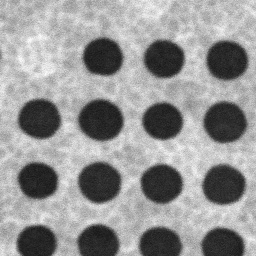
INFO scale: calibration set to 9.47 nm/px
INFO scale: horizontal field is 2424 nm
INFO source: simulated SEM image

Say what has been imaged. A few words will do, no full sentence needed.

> a regular array of holes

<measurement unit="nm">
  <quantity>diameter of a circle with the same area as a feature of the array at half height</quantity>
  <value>398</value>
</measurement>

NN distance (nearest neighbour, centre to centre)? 582 nanometers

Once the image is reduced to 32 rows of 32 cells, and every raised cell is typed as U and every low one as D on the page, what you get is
UUUUUUUUUUUUUUUUUUUUUUUUUUUUUUUU
UUUUUUUUUUUUUUUUUUUUUUUUUUUUUUUU
UUUUUUUUUUUUUUUUUUUUUUUUUUUUUUUU
UUUUUUUUUUUUUUUUUUUUUUUUUUUUUUUU
UUUUUUUUUUUUUUUUUUUUUUUUUUUUUUUU
UUUUUUUUUUUDDDDUUUUDDDUUUUUDDDUU
UUUUUUUUUUDDDDDUUUDDDDDUUUDDDDDU
UUUUUUUUUUDDDDDUUUDDDDDUUUDDDDDU
UUUUUUUUUUUDDDDUUUDDDDDUUUDDDDDU
UUUUUUUUUUUUUUUUUUUDDDUUUUUDDDUU
UUUUUUUUUUUUUUUUUUUUUUUUUUUUUUUU
UUUUUUUUUUUUUUUUUUUUUUUUUUUUUUUU
UUUUDDUUUUUUDUUUUUUUUUUUUUUUUUUU
UUUDDDDUUUDDDDDUUUDDDDUUUUDDDDUU
UUDDDDDDUUDDDDDUUUDDDDDUUDDDDDDU
UUDDDDDDUUDDDDDUUUDDDDDUUDDDDDDU
UUUDDDDUUUDDDDDUUUDDDDDUUUDDDDDU
UUUUUUUUUUUUDDUUUUUUDUUUUUUDDDUU
UUUUUUUUUUUUUUUUUUUUUUUUUUUUUUUU
UUUUUUUUUUUUUUUUUUUUUUUUUUUUUUUU
UUUDDDUUUUUDDDUUUUUUUUUUUUUUUUUU
UUDDDDDUUUDDDDDUUUDDDDUUUUDDDDUU
UUDDDDDUUUDDDDDUUUDDDDDUUDDDDDDU
UUUDDDDUUUDDDDDUUUDDDDDUUDDDDDDU
UUUDDDUUUUDDDDDUUUDDDDUUUUDDDDUU
UUUUUUUUUUUUUUUUUUUUDUUUUUUDDUUU
UUUUUUUUUUUUUUUUUUUUUUUUUUUUUUUU
UUUUUUUUUUUUUUUUUUUUUUUUUUUUUUUU
UUUDDDUUUUUDDDUUUUUDDUUUUUUDUUUU
UUDDDDDUUUDDDDDUUUDDDDUUUDDDDDUU
UUDDDDDUUUDDDDDUUDDDDDDUUDDDDDDU
UUDDDDDUUUDDDDDUUDDDDDDUUDDDDDDU